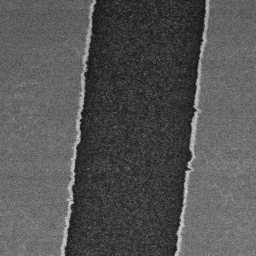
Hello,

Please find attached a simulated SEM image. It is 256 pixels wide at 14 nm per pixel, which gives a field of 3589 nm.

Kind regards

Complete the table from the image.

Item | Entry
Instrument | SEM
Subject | one or a few lines or trenches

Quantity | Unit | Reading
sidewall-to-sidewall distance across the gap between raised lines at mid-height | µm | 1.6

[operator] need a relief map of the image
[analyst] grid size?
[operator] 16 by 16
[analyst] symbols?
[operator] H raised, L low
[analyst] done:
HHHHHHLLLLLLLHHH
HHHHHHLLLLLLLHHH
HHHHHLLLLLLLLHHH
HHHHHLLLLLLLLHHH
HHHHHLLLLLLLHHHH
HHHHHLLLLLLLHHHH
HHHHHLLLLLLLHHHH
HHHHHLLLLLLLHHHH
HHHHHLLLLLLLHHHH
HHHHHLLLLLLLHHHH
HHHHHLLLLLLLHHHH
HHHHLLLLLLLLHHHH
HHHHLLLLLLLLHHHH
HHHHLLLLLLLHHHHH
HHHHLLLLLLLHHHHH
HHHHLLLLLLLHHHHH